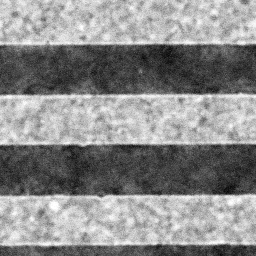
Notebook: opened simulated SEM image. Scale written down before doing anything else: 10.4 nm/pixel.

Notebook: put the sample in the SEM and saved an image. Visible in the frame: one or a few lines or trenches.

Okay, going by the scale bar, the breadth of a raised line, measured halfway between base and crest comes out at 0.492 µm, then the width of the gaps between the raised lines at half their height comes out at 551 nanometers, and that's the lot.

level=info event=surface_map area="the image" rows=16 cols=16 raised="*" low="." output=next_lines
****************
****************
****************
................
................
................
****************
****************
****************
................
................
................
****************
****************
****************
................